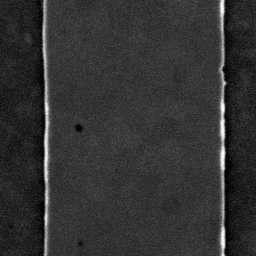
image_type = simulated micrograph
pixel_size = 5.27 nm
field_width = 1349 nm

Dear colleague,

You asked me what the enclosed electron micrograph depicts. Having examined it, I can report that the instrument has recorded one or a few lines or trenches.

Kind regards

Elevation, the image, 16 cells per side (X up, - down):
---XXXXXXXXXXX--
---XXXXXXXXXXX--
---XXXXXXXXXXX--
---XXXXXXXXXXX--
---XXXXXXXXXXX--
---XXXXXXXXXXX--
---XXXXXXXXXXX--
---XXXXXXXXXXX--
---XXXXXXXXXXX--
---XXXXXXXXXXX--
---XXXXXXXXXXX--
---XXXXXXXXXXX--
---XXXXXXXXXXX--
---XXXXXXXXXXX--
---XXXXXXXXXXX--
---XXXXXXXXXXX--